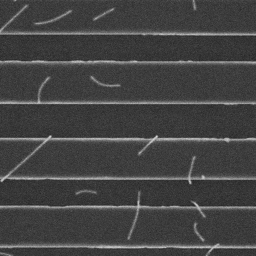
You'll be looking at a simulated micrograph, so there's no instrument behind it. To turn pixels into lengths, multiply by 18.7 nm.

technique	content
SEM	lines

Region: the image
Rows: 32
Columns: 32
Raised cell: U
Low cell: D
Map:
UUUUUUUUUUUUUUUUUUUUUUUUUUUUUUUU
UUUUUUUUUUUUUUUUUUUUUUUUUUUUUUUU
UUUUUUUUUUUUUUUUUUUUUUUUUUUUUUUU
UUUUUUUUUUUUUUUUUUUUUUUUUUUUUUUU
DDDDDDDDDDDDDDDDDDDDDDDDDDDDDDDD
DDDDDDDDDDDDDDDDDDDDDDDDDDDDDDDD
DDDDDDDDDDDDDDDDDDDDDDDDDDDDDDDD
DDDDDDDDDDDDDDDDDDDDDDDDDDDDDDDD
UUUUUUUUUUUUUUUUUUUUUUUUUUUUUUUU
UUUUUUUUUUUUUUUUUUUUUUUUUUUUUUUU
UUUUUUUUUUUUUUUUUUUUUUUUUUUUUUUU
UUUUUUUUUUUUUUUUUUUUUUUUUUUUUUUU
UUUUUUUUUUUUUUUUUUUUUUUUUUUUUUUU
DDDDDDDDDDDDDDDDDDDDDDDDDDDDDDDD
DDDDDDDDDDDDDDDDDDDDDDDDDDDDDDDD
DDDDDDDDDDDDDDDDDDDDDDDDDDDDDDDD
DDDDDDDDDDDDDDDDDDDDDDDDDDDDDDDD
UUUUUUUUUUUUUUUUUUUUUUUUUUUUUUUU
UUUUUUUUUUUUUUUUUUUUUUUUUUUUUUUU
UUUUUUUUUUUUUUUUUUUUUUUUUUUUUUUU
UUUUUUUUUUUUUUUUUUUUUUUUUUUUUUUU
UUUUUUUUUUUUUUUUUUUUUUUUUUUUUUUU
DDDDDDDDDDDDDDDDDDDDDDDDDDDDDDDD
DDDDDDDDDDDDDDDDDDDDDDDDDDDDDDDD
DDDDDDDDDDDDDDDDDDDDDDDDDDDDDDDD
DDDDDDDDDDDDDDDDDDDDDDDDDDDDDDDD
UUUUUUUUUUUUUUUUUUUUUUUUUUUUUUUU
UUUUUUUUUUUUUUUUUUUUUUUUUUUUUUUU
UUUUUUUUUUUUUUUUUUUUUUUUUUUUUUUU
UUUUUUUUUUUUUUUUUUUUUUUUUUUUUUUU
UUUUUUUUUUUUUUUUUUUUUUUUUUUUUUUU
DDDDDDDDDDDDDDDDDDDDDDDDDDDDDDDD